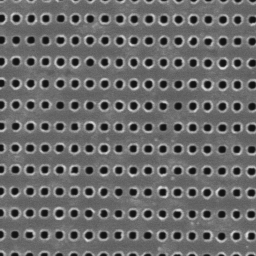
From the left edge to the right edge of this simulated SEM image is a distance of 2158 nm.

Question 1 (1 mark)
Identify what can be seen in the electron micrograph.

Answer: a regular array of holes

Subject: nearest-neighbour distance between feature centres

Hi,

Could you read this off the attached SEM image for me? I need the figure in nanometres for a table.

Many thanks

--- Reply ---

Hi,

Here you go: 122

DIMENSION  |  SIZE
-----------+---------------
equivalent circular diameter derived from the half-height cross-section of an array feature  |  66.6 nm